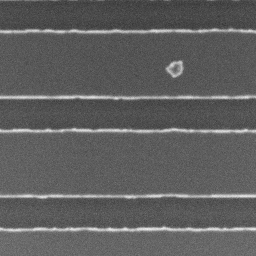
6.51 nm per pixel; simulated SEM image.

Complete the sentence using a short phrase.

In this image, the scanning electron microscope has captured lines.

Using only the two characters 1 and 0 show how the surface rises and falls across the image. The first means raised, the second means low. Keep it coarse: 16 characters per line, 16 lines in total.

0000000000000000
0000000000000000
1111111111111111
1111111111111111
1111111111111111
1111111111111111
0000000000000000
0000000000000000
1111111111111111
1111111111111111
1111111111111111
1111111111111111
0000000000000000
0000000000000000
1111111111111111
1111111111111111